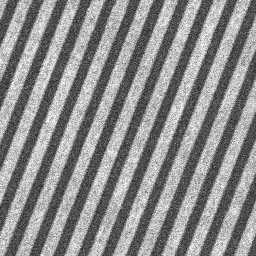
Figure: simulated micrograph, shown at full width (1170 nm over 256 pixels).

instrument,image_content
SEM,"parallel lines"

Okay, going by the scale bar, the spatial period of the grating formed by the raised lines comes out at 103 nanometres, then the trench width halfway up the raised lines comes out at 55.3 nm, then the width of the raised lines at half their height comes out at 51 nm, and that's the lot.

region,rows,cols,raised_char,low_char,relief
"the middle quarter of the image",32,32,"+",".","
.+++...+++...+++...+++...+++...+
+++...+++...+++...+++....++....+
+++...+++...+++...+++...+++...++
++....++....+++...+++...+++...++
++...+++...+++...+++....++....++
++...+++...+++...+++...+++...+++
+....++....++....++....++....+++
+...+++...+++...+++...+++...+++.
....++....+++...+++...+++...+++.
...+++...+++...+++...+++....++..
...+++...+++...+++...+++...+++..
...++....++....++....++....+++..
..+++...+++...+++...+++...+++...
..++....+++...+++...+++...+++...
.+++...+++...+++....++....++....
.+++...+++...+++...+++...+++...+
.++....+++...+++...+++...+++...+
+++...+++...+++...+++...+++...++
+++...+++...+++...+++...+++...++
++...+++...+++....++....+++...++
++...+++...+++...+++...+++...+++
+....+++...+++...+++...+++...+++
+...+++...+++...+++...+++...+++.
+...+++...+++...+++...+++...+++.
...+++...+++....++....+++...+++.
...+++...+++...+++...+++...+++..
...+++...+++...+++...+++...+++..
..+++...+++...+++...+++...+++...
..+++...+++...+++...+++...+++...
.+++...+++....++....+++...+++...
.+++...+++...+++...+++...+++...+
.+++...+++...+++...+++...+++...+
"